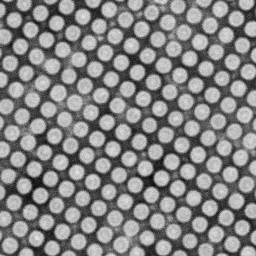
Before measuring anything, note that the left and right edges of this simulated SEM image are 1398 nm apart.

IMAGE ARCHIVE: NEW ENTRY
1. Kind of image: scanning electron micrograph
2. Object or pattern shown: a regular array of raised bodies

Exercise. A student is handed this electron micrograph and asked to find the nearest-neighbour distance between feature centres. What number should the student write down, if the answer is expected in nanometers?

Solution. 103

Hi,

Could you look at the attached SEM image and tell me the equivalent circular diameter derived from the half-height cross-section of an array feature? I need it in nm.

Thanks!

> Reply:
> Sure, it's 76.4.